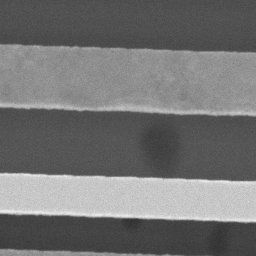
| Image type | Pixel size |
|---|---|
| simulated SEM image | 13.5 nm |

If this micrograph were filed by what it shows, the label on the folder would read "lines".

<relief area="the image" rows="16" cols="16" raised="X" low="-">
----------------
----------------
----------------
XXXXXXXXXXXXXXXX
XXXXXXXXXXXXXXXX
XXXXXXXXXXXXXXXX
XXXXXXXXXXXXXXXX
----------------
----------------
----------------
----------------
XXXXXXXXXXXXXXXX
XXXXXXXXXXXXXXXX
------XXXXXXXXXX
----------------
----------------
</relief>